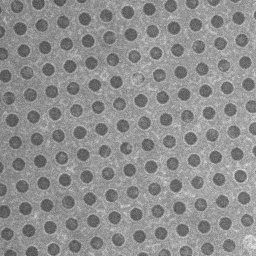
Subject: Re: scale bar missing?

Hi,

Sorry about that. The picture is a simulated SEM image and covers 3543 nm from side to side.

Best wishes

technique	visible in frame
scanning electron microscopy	a regular array of holes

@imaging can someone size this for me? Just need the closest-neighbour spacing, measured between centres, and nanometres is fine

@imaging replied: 300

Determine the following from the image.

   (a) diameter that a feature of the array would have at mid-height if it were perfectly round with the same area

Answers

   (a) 188 nm